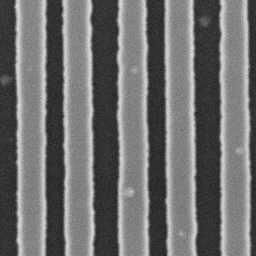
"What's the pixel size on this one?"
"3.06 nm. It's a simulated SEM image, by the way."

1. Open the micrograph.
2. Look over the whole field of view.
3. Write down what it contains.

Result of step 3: lines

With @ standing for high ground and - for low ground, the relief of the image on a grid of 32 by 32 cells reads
--@@@@--@@@----@@@---@@@----@@@-
--@@@@--@@@----@@@---@@@----@@@-
--@@@@--@@@----@@@---@@@----@@@-
--@@@@--@@@----@@@---@@@----@@@-
--@@@@--@@@----@@@---@@@----@@@-
--@@@@--@@@----@@@---@@@----@@@-
--@@@@--@@@----@@@---@@@----@@@-
--@@@@--@@@----@@@---@@@----@@@-
--@@@@--@@@----@@@---@@@----@@@-
--@@@@--@@@----@@@---@@@----@@@-
--@@@@--@@@----@@@---@@@----@@@-
--@@@@--@@@@---@@@---@@@----@@@-
--@@@@--@@@----@@@---@@@----@@@-
--@@@@--@@@@---@@@---@@@----@@@-
--@@@@--@@@@---@@@---@@@----@@@-
--@@@@--@@@----@@@---@@@----@@@-
--@@@@--@@@@---@@@---@@@----@@@-
--@@@@--@@@@---@@@@--@@@----@@@-
--@@@@--@@@@---@@@@--@@@----@@@-
--@@@@--@@@@---@@@@--@@@----@@@-
--@@@@--@@@@---@@@@--@@@----@@@-
--@@@@--@@@@---@@@---@@@----@@@-
--@@@@--@@@@---@@@@--@@@----@@@-
--@@@@--@@@@---@@@---@@@----@@@-
--@@@@--@@@@---@@@@--@@@----@@@-
--@@@@--@@@@---@@@@--@@@----@@@-
--@@@@--@@@@---@@@@--@@@----@@@-
--@@@@--@@@@---@@@@--@@@----@@@-
--@@@@--@@@@---@@@@--@@@@---@@@-
--@@@@--@@@@---@@@@--@@@----@@@-
--@@@@--@@@@---@@@@--@@@----@@@-
--@@@@--@@@@---@@@@--@@@----@@@-